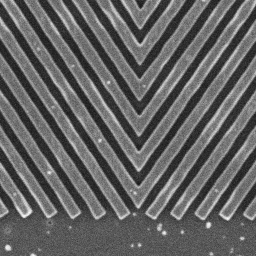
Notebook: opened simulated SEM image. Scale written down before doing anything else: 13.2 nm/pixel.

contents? groups of lines, slits or small figures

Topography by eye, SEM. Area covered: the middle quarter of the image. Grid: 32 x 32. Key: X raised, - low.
-XXX---XXX---XXX-----XXXX---XXX-
--XXX---XXX---XXX----XXX---XXX--
--XXX---XXXX--XXXX--XXXX---XXX--
---XXX---XXX---XXX-XXXX---XXX---
X---XXX---XXX---XXXXXX---XXX---X
X---XXX---XXXX--XXXXX----XX---XX
XX---XXX---XXX---XXXX---XXX---XX
XXX--XXXX---XXX---XX---XXX---XXX
XXXX--XXX---XXXX--X---XXXX--XXXX
-XXX---XXX---XXX------XXX---XXX-
--XXX--XXX----XXX----XXX---XXX--
--XXXX--XXX---XXXX--XXX---XXXX--
---XXX---XXX---XXX-XXXX---XXX---
X---XXX---XXX---XXXXXX---XXX---X
X---XXXX--XXX---XXXXX---XXXX--XX
XX---XXX---XXX---XXXX--XXXX--XXX
XXX--XXXX---XXX---XX---XXX---XXX
XXX---XXX---XXX---X---XXXX--XXXX
-XXX---XXX---XXX-----XXXX--XXXX-
--XXX--XXXX---XXX----XXX---XXX--
--XXX---XXX---XXXX--XXX---XXXX--
---XXX---XXX---XXX-XXXX--XXXX--X
X--XXXX--XXXX--XXXXXXX---XXX---X
XX--XXX---XXX---XXXXX---XXX---XX
XX---XXX---XXX---XXX---XXXX--XXX
XXX--XXXX---XXX---XX---XXX---XXX
XXX---XXX---XXX-------XXX---XXX-
-XXX---XXX---XXX-----XXXX--XXX--
-XXXX--XXXX---XXX---XXXX---XXX--
--XXX---XXX---XXXX--XXX---XXX---
---XXX---XXX---XXX-XXX----XX---X
X--XXXX--XXXX--XXXXXXX---XXX---X